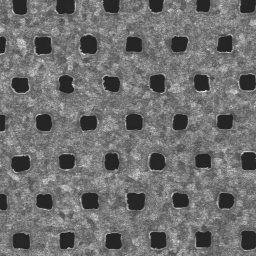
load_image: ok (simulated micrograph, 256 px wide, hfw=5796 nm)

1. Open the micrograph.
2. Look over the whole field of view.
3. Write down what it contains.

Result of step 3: a regular array of holes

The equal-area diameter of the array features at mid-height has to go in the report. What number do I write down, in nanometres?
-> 386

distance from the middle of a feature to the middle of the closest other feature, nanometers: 1010